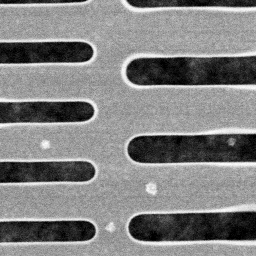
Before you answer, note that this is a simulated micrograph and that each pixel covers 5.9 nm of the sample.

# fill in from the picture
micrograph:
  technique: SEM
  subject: groups of lines, slits or small figures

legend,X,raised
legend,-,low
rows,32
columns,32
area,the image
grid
--------XXXXXXXX----------------
XXXXXXXXXXXXXXXXXXXXXXXXXXXXXXXX
XXXXXXXXXXXXXXXXXXXXXXXXXXXXXXXX
XXXXXXXXXXXXXXXXXXXXXXXXXXXXXXXX
XXXXXXXXXXXXXXXXXXXXXXXXXXXXXXXX
-----------XXXXXXXXXXXXXXXXXXXXX
------------XXXXXXXXXXXXXXXXXXXX
-----------XXXXX----------------
XXXXXXXXXXXXXXXX----------------
XXXXXXXXXXXXXXXX----------------
XXXXXXXXXXXXXXXX----------------
XXXXXXXXXXXXXXXXXXXXXXXXXXXXXXXX
XXXXXXXXXXXXXXXXXXXXXXXXXXXXXXXX
------------XXXXXXXXXXXXXXXXXXXX
------------XXXXXXXXXXXXXXXXXXXX
-XXXXXXXXXXXXXXXXXXXXXXXXXXXXXXX
XXXXXXXXXXXXXXXXXXXXXXXXXXXX---X
XXXXXXXXXXXXXXXX----------------
XXXXXXXXXXXXXXXX----------------
XXXXXXXXXXXXXXXX----------------
-----------XXXXXXX---XXXXXXX----
------------XXXXXXXXXXXXXXXXXXXX
-----------XXXXXXXXXXXXXXXXXXXXX
XXXXXXXXXXXXXXXXXXXXXXXXXXXXXXXX
XXXXXXXXXXXXXXXXXXXXXXXXXXXXXXXX
XXXXXXXXXXXXXXXXXXXXXXXXXXXXXXXX
XXXXXXXXXXXXXXXXXXXXXXXXXX------
XX---XX---XXXXXX----------------
------------XXXX----------------
------------XXXX----------------
XXXXXXXXXXXXXXXXXXXXXXXXXXXXXXXX
XXXXXXXXXXXXXXXXXXXXXXXXXXXXXXXX